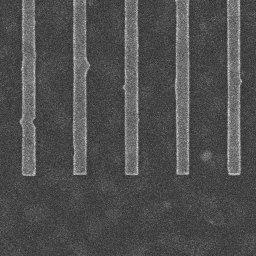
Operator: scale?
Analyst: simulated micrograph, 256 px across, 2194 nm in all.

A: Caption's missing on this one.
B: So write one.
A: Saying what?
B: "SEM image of parallel lines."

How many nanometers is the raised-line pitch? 439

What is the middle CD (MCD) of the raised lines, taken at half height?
0.104 micrometres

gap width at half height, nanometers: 336